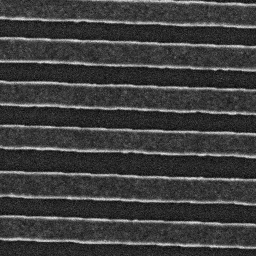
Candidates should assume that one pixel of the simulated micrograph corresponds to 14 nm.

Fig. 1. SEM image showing lines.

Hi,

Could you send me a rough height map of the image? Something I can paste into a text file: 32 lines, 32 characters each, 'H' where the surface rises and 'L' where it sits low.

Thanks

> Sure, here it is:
HHHHHHHHHHHHHHHHHHHHHHHHHHHHHHLL
HHHHHHHHHHHHHHHHHHHHHHHHHHHHHHHH
LLLLLHHHHHHHHHHHHHHHHHHHHHHHHHHH
LLLLLLLLLLLLLLLLLLLLLLLLLLLLLLLL
LLLLLLLLLLLLLLLLLLLLLLLLLLLLLLLL
HHHHHHHHHHHHHHHHHHHHLLLLLLLLLLLL
HHHHHHHHHHHHHHHHHHHHHHHHHHHHHHHH
HHHHHHHHHHHHHHHHHHHHHHHHHHHHHHHH
LLLLLLLLLLLLLLLLLLLLLLLLHHHHHHHH
LLLLLLLLLLLLLLLLLLLLLLLLLLLLLLLL
HHHHHHHHHLLLLLLLLLLLLLLLLLLLLLLL
HHHHHHHHHHHHHHHHHHHHHHHHHHHHHHHH
HHHHHHHHHHHHHHHHHHHHHHHHHHHHHHHH
LLLLLLLLLLHHHHHHHHHHHHHHHHHHHHHH
LLLLLLLLLLLLLLLLLLLLLLLLLLLLLLLL
LLLLLLLLLLLLLLLLLLLLLLLLLLLLLLLL
HHHHHHHHHHHHHHHHHHHHHHHHHLLLLLLL
HHHHHHHHHHHHHHHHHHHHHHHHHHHHHHHH
HHHHHHHHHHHHHHHHHHHHHHHHHHHHHHHH
LLLLLLLLLLLLLLLLLLLLLLLLLLLLLLHH
LLLLLLLLLLLLLLLLLLLLLLLLLLLLLLLL
LLLLLLLLLLLLLLLLLLLLLLLLLLLLLLLL
HHHHHHHHHHHHHHHHHHHHHHHHHHHHHHHH
HHHHHHHHHHHHHHHHHHHHHHHHHHHHHHHH
LLHHHHHHHHHHHHHHHHHHHHHHHHHHHHHH
LLLLLLLLLLLLLLLLLLLLLLLLLLLLLLHH
LLLLLLLLLLLLLLLLLLLLLLLLLLLLLLLL
HHHHHHHHHHHHLLLLLLLLLLLLLLLLLLLL
HHHHHHHHHHHHHHHHHHHHHHHHHHHHHHHH
HHHHHHHHHHHHHHHHHHHHHHHHHHHHHHHH
LLLLLLLLLLLLLLLLLLLLHHHHHHHHHHHH
LLLLLLLLLLLLLLLLLLLLLLLLLLLLLLLL